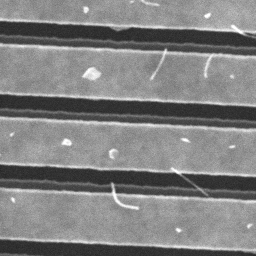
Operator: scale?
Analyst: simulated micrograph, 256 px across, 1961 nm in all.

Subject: lines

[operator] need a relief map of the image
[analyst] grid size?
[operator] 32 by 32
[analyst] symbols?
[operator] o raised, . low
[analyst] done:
oooooooooooooooooooooooooooooooo
oooooooooooooooooooooooooooooooo
oooooooooooooooooooooooooooooooo
..................oooooooooooooo
................................
o...............................
ooooooooooooooooooooo...........
oooooooooooooooooooooooooooooooo
oooooooooooooooooooooooooooooooo
oooooooooooooooooooooooooooooooo
oooooooooooooooooooooooooooooooo
oooooooooooooooooooooooooooooooo
..............oooooooooooooooooo
................................
................................
ooooooooooooooooooo.............
oooooooooooooooooooooooooooooooo
oooooooooooooooooooooooooooooooo
oooooooooooooooooooooooooooooooo
oooooooooooooooooooooooooooooooo
oooooooooooooooooooooooooooooooo
......................oooooooooo
................................
................................
ooooooooooooooooooooo...........
oooooooooooooooooooooooooooooooo
oooooooooooooooooooooooooooooooo
oooooooooooooooooooooooooooooooo
oooooooooooooooooooooooooooooooo
oooooooooooooooooooooooooooooooo
.............ooooooooooooooooooo
................................